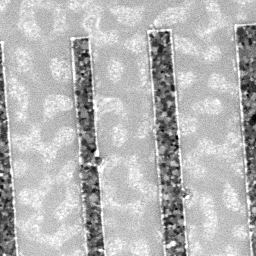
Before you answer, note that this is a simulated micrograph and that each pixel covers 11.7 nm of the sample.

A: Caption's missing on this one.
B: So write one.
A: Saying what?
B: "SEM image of one or a few lines or trenches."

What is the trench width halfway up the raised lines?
744 nm